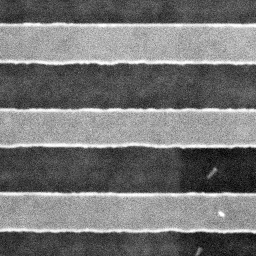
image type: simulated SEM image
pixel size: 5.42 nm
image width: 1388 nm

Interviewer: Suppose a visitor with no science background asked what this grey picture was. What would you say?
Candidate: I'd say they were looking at lines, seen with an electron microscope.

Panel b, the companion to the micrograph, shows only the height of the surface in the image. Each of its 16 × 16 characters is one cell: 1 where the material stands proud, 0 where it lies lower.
0000000000000000
1111100000000000
1111111111111111
1111111111111111
0000000000000000
0000000000000000
0000000000000000
1111111111111111
1111111111111111
0000000000000000
0000000000000000
0000000000000000
1111111111111111
1111111111111111
0000000000000011
0000000000000000